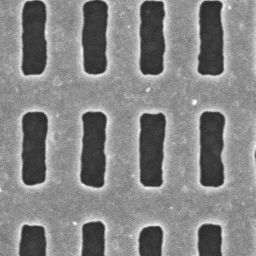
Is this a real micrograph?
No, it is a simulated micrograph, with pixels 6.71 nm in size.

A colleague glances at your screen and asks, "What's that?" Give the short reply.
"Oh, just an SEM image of holes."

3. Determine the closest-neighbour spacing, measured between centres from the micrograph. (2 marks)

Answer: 399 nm